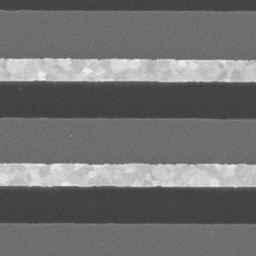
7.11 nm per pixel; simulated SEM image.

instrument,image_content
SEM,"lines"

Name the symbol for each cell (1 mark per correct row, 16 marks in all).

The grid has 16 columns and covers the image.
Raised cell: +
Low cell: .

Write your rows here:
................
++++++++++++++++
++++++++++++++++
++++++++++++++++
++++++++++++++++
................
................
++++++++++++++++
++++++++++++++++
++++++++++++++++
++++++++++++++++
++++++++++++++++
................
................
++++++++++++++++
++++++++++++++++